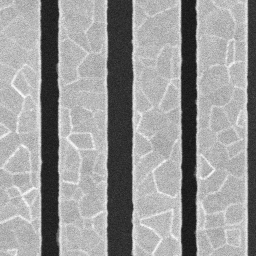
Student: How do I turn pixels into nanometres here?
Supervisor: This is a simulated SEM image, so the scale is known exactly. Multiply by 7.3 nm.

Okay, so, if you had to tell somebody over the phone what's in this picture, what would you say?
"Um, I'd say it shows lines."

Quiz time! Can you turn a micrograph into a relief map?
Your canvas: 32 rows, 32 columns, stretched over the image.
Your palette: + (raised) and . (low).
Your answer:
+++++..++++++....++++++..++++++.
+++++..++++++....++++++..++++++.
+++++..++++++....++++++..++++++.
+++++..++++++....++++++..++++++.
+++++..++++++....++++++..++++++.
+++++..++++++....++++++..++++++.
+++++..++++++....++++++..++++++.
+++++..++++++....++++++..++++++.
+++++..++++++....++++++..++++++.
+++++..++++++....++++++..++++++.
+++++..++++++....++++++..++++++.
+++++..++++++....++++++..++++++.
+++++..++++++....++++++..++++++.
+++++..++++++....++++++..++++++.
+++++..++++++....++++++..++++++.
+++++..++++++....++++++..++++++.
+++++..++++++....++++++..++++++.
+++++..++++++....++++++..++++++.
+++++..++++++....++++++..++++++.
+++++..++++++....++++++..++++++.
+++++..++++++....++++++..++++++.
+++++..++++++....++++++..++++++.
+++++..++++++....++++++..++++++.
+++++..++++++....++++++..++++++.
+++++..++++++....++++++..++++++.
+++++..++++++....++++++..++++++.
+++++..++++++....++++++..++++++.
+++++..++++++....++++++..++++++.
+++++..++++++....++++++..++++++.
+++++..++++++....++++++..++++++.
+++++..++++++....++++++..++++++.
+++++..++++++....++++++..++++++.